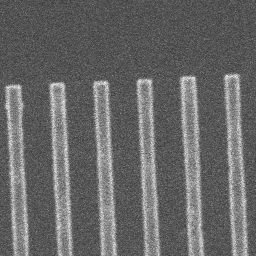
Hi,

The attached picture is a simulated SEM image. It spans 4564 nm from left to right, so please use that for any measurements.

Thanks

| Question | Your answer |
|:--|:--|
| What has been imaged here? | parallel lines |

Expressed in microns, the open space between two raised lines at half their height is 0.565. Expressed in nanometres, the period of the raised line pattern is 779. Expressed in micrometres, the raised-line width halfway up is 0.218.